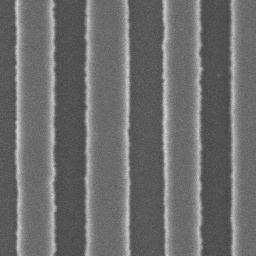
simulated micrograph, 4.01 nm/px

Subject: lines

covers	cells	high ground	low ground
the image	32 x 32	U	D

DDUUUUUDDDDUUUUUDDDDUUUUUDDDDUUU
DDUUUUUDDDDUUUUUDDDDUUUUUDDDDUUU
DDUUUUUDDDDUUUUUDDDDUUUUUDDDDUUU
DDUUUUUDDDDUUUUUDDDDDUUUUDDDDUUU
DDUUUUUDDDDUUUUUDDDDDUUUUDDDDUUU
DDUUUUUDDDDUUUUUDDDDUUUUUDDDDUUU
DDUUUUUDDDDUUUUUDDDDUUUUUDDDDUUU
DDUUUUUDDDDUUUUUDDDDDUUUUDDDDUUU
DDUUUUUDDDDUUUUUDDDDUUUUUDDDDUUU
DDUUUUUDDDDUUUUUDDDDUUUUUDDDDUUU
DDUUUUUDDDDUUUUUDDDDDUUUUDDDDUUU
DDUUUUUDDDDUUUUUDDDDDUUUUDDDDUUU
DDUUUUUDDDDUUUUUDDDDUUUUUDDDDUUU
DDUUUUUDDDDUUUUUDDDDUUUUUDDDDUUU
DDUUUUUDDDDUUUUUDDDDDUUUUDDDDUUU
DDUUUUUDDDDUUUUUDDDDUUUUUDDDDUUU
DDUUUUUDDDDUUUUUDDDDDUUUUDDDDUUU
DDUUUUUDDDDUUUUUDDDDDUUUUDDDDUUU
DDUUUUUDDDDUUUUUDDDDDUUUUDDDDUUU
DDUUUUUDDDDUUUUUDDDDDUUUUDDDDUUU
DDUUUUUDDDDUUUUUDDDDDUUUUDDDDUUU
DDUUUUUDDDDUUUUUDDDDDUUUUDDDDUUU
DDUUUUUDDDDUUUUUDDDDDUUUUDDDDUUU
DDUUUUUDDDDUUUUUDDDDDUUUUDDDDUUU
DDUUUUUDDDDUUUUUDDDDDUUUUDDDDUUU
DDUUUUUDDDDUUUUUDDDDDUUUUDDDDUUU
DDUUUUUDDDDUUUUUDDDDDUUUUDDDDUUU
DDUUUUUDDDDUUUUUDDDDDUUUUDDDDUUU
DDUUUUUDDDDUUUUUDDDDDUUUUDDDDUUU
DDUUUUUDDDDUUUUUDDDDDUUUUDDDDUUU
DDUUUUUDDDDUUUUUDDDDDUUUUDDDDUUU
DDUUUUUDDDDUUUUUDDDDDUUUUDDDDUUU